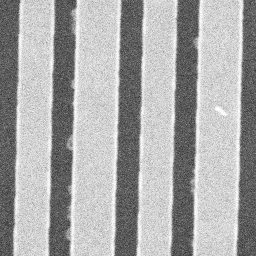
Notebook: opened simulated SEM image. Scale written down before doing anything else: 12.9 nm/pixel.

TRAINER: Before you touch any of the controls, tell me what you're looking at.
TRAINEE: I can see lines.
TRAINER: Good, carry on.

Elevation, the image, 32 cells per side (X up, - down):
---XXXX---XXXXX---XXXX---XXXXX--
---XXXX---XXXXX---XXXX---XXXXX--
---XXXX---XXXXX---XXXX---XXXXX--
---XXXX---XXXXX---XXXX---XXXXX--
--XXXXX---XXXXX---XXXX---XXXXX--
--XXXXX---XXXXX---XXXX---XXXXX--
--XXXXX--XXXXXX---XXXX---XXXXX--
--XXXXX--XXXXXX---XXXX---XXXXX--
--XXXXX--XXXXXX---XXXX---XXXXX--
--XXXX---XXXXXX---XXXX---XXXXX--
--XXXX---XXXXXX---XXXX---XXXXX--
--XXXX---XXXXXX---XXXX---XXXXX--
--XXXX---XXXXXX---XXXX---XXXXX--
--XXXX---XXXXXX---XXXX---XXXXX--
--XXXX---XXXXXX---XXXX---XXXXX--
--XXXX---XXXXXX---XXXX---XXXXX--
--XXXX---XXXXXX---XXXX---XXXXX--
--XXXX---XXXXXX---XXXX---XXXXX--
--XXXX---XXXXXX---XXXX---XXXXX--
--XXXX---XXXXXX---XXXX--XXXXXX--
--XXXX---XXXXX----XXXX--XXXXXX--
--XXXX---XXXXX---XXXX---XXXXXX--
--XXXX---XXXXX---XXXX---XXXXXX--
--XXXX---XXXXX---XXXX---XXXXXX--
--XXXX---XXXXX---XXXX---XXXXXX--
--XXXX---XXXXX---XXXX---XXXXXX--
--XXXX---XXXXX---XXXX---XXXXXX--
--XXXX---XXXXX---XXXX---XXXXXX--
--XXXX---XXXXX---XXXX---XXXXXX--
--XXXX---XXXXX---XXXX---XXXXXX--
--XXXX---XXXXX---XXXX---XXXXXX--
--XXXX---XXXXX---XXXX---XXXXX---